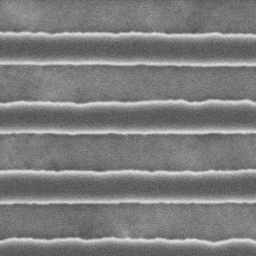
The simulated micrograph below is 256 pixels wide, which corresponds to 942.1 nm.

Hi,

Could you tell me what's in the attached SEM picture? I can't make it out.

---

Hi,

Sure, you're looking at lines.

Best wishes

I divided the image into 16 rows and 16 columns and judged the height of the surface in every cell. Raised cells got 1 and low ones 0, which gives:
0000000000000000
0000000000000000
1111111111111111
1111111111111111
0000000000000000
0000000000000000
1111111111111111
1111111111111111
0000000000000000
0000000000000000
0000000000000000
1111111111111111
1111111111111111
0000000000000000
0000000000000000
1111111111111111